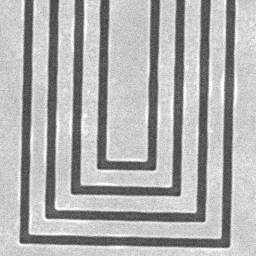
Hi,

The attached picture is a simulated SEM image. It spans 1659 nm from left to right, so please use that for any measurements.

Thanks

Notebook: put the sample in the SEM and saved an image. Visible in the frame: groups of lines, slits or small figures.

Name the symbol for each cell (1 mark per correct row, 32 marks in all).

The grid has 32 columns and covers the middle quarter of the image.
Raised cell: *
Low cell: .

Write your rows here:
**...***...**********...***...**
**...***...**********...***...**
**...***...**********...***...**
**...***...**********...***...**
**...***...**********...***...**
**...***...**********...***...**
**...***...**********...***...**
**...***...**********...***...**
**...***...**********...***...**
**...***...**********...***...**
**...***...**********...***...**
**...***...**********...***...**
**...***...**********...***...**
**...***...**********...***...**
**...***...**********...***...**
**...***...**********...***...**
**...***...**********...***...**
**..****...**********...***...**
**..****...**********...***...**
**..****...**********..****...**
**..****...**********..****...**
**..****...**********..****...**
**..****...**********..****...**
**..****...**********..****...**
**..****...............****...**
**..****...............****...**
**..*****..............****...**
*...***********************...**
*...***********************...**
*...***********************...**
*.................*********...**
*............................***